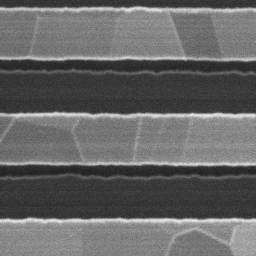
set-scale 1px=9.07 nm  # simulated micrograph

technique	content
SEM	lines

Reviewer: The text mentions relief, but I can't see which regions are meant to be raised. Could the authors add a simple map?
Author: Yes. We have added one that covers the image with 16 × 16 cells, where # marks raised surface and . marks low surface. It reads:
###.######......
################
################
################
................
................
................
################
################
################
................
................
................
................
################
################